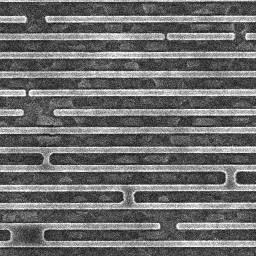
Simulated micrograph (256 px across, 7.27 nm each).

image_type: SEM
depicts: parallel lines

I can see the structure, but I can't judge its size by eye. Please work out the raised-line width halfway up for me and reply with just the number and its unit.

39.1 nm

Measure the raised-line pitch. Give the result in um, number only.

0.136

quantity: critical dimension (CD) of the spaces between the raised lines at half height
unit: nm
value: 96.3